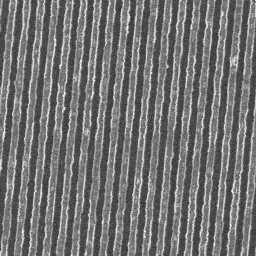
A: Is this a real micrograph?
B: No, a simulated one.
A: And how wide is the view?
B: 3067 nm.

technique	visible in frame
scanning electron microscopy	parallel lines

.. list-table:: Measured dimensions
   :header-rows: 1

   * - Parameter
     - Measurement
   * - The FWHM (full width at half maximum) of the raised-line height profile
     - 7.46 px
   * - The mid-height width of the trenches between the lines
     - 79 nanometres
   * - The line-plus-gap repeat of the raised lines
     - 169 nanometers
